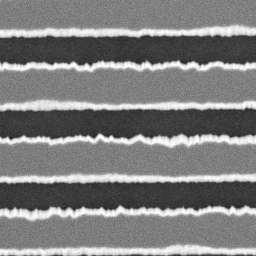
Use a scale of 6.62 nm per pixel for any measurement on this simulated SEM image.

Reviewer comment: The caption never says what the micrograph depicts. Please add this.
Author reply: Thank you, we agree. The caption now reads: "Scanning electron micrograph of lines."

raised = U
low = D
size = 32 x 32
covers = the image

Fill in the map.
UUUUUUUUUUUUUUUUUUUUUUUUUUUUUUUU
UUUUUUUUUUUUUUUUUUUUUUUUUUUUUUUU
UUUUUUUUUUUUUUUUUUUUUUUUUUUUUUUU
UUUUUUUUUUUUUUUUUUUUUUUUUUUUUUUU
UDDDDDDDDDDDDDDDDDDDDDDDDDDDDDDD
DDDDDDDDDDDDDDDDDDDDDDDDDDDDDDDD
DDDDDDDDDDDDDDDDDDDDDDDDDDDDDDDD
DDDDDDDDDDDDDDDDDDDDDDDDDDDDDDDD
UUUUUUUUUUUUUUUUUUUUUUUUUUUUUUUU
UUUUUUUUUUUUUUUUUUUUUUUUUUUUUUUU
UUUUUUUUUUUUUUUUUUUUUUUUUUUUUUUU
UUUUUUUUUUUUUUUUUUUUUUUUUUUUUUUU
UUUUUUUUUUUUUUUUUUUUUUUUUUUUUUUU
UUUUUDDDDDUUUUUUDUDDDDDDDUDDDDDD
DDDDDDDDDDDDDDDDDDDDDDDDDDDDDDDD
DDDDDDDDDDDDDDDDDDDDDDDDDDDDDDDD
DDDDDDDDDDDDDDDDDDDDDDDDDDDDDDDD
UUUUUUUUUUUUUUUUUUUUUUUUUUUUUUUU
UUUUUUUUUUUUUUUUUUUUUUUUUUUUUUUU
UUUUUUUUUUUUUUUUUUUUUUUUUUUUUUUU
UUUUUUUUUUUUUUUUUUUUUUUUUUUUUUUU
UUUUUUUUUUUUUUUUUUUUUUUUUUUUUUUU
UUUUUUUUUUUUUUUUUUUUUUUUUUUUUDDU
DDDDDDDDDDDDDDDDDDDDDDDDDDDDDDDD
DDDDDDDDDDDDDDDDDDDDDDDDDDDDDDDD
DDDDDDDDDDDDDDDDDDDDDDDDDDDDDDDD
UUUDUDUUUUUUUUUUUUUUUUUUUUUUUUUU
UUUUUUUUUUUUUUUUUUUUUUUUUUUUUUUU
UUUUUUUUUUUUUUUUUUUUUUUUUUUUUUUU
UUUUUUUUUUUUUUUUUUUUUUUUUUUUUUUU
UUUUUUUUUUUUUUUUUUUUUUUUUUUUUUUU
UUUUUUUUUUUUUUUUUUUUUUUUUUUUUUUU